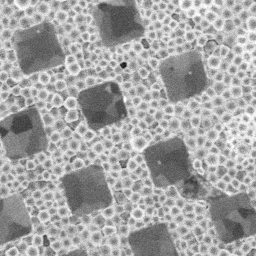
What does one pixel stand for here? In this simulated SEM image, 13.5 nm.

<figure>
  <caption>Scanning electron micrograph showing raised bodies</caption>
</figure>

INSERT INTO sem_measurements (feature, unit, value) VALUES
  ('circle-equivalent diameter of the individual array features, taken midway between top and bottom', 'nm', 665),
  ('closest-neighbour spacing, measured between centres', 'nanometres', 1160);